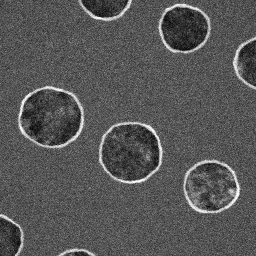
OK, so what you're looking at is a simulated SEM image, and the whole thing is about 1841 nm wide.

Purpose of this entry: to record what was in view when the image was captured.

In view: holes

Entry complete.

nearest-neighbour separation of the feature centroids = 626 nm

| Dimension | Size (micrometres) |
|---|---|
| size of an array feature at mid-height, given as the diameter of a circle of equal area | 0.399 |